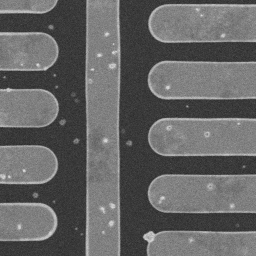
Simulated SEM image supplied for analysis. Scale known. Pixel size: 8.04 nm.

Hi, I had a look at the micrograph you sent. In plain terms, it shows groups of lines, slits or small figures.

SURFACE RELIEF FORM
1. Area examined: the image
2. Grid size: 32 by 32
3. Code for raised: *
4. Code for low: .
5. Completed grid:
*******....****.................
....**.....****....*************
...........****....*************
...........****....*************
******.....****....*************
*******....****.................
*******....****.................
*******....****.................
******.....****....*************
...........****....*************
...........****....*************
******.....****....*************
*******....****.................
*******....****.................
*******....****.................
******.....****....*************
...........****....*************
...........****....*************
******.....****....*************
*******....****.................
*******....****.................
*******....****.................
******.....****....*************
...........****....*************
...........****....*************
****.......****....*************
*******....****......***********
*******....****.................
*******....****.................
******.....****...**************
...........****...**************
...........****...**************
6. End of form